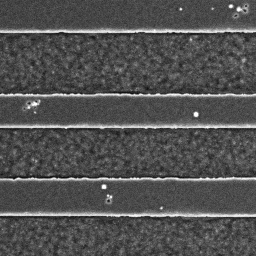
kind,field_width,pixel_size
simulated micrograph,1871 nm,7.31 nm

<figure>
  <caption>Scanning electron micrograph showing lines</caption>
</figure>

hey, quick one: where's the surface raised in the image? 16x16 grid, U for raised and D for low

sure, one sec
UUUUUUUUUUUUUUUU
UUUUUUUUUUUUUUUU
DDDDDDDDDDDDDDDD
DDDDDDDDDDDDDDDD
DDDDDDDDDDDDDDDD
DDDDDDDDDDDDDDDD
UUUUUUUUUUUUUUUU
UUUUUUUUUUUUUUUU
DDDDDDDDDDDDDDDD
DDDDDDDDDDDDDDDD
DDDDDDDDDDDDDDDD
UUUUUUUUUUUUUUUU
UUUUUUUUUUUUUUUU
DDDDDDUUUUUDUUUU
DDDDDDDDDDDDDDDD
DDDDDDDDDDDDDDDD